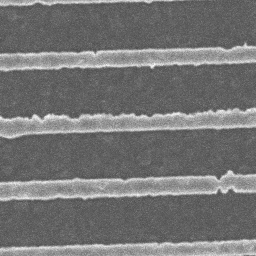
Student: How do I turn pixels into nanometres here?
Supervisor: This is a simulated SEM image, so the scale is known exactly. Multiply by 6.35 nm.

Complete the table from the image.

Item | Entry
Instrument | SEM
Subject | one or a few lines or trenches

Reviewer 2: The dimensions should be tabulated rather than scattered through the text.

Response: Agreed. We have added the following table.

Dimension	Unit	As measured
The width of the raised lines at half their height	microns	0.101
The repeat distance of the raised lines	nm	409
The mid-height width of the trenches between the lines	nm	309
